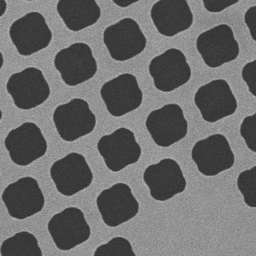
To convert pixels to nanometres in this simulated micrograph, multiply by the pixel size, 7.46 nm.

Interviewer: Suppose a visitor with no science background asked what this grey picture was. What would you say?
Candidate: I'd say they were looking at a regular array of holes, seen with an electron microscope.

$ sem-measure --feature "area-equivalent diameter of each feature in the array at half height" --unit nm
304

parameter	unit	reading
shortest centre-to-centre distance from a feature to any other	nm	402